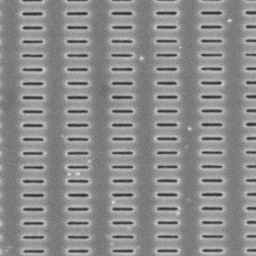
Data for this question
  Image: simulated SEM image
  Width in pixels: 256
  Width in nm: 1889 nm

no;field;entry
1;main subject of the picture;a regular array of holes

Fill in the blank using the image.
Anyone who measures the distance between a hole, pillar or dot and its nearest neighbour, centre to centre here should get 102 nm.